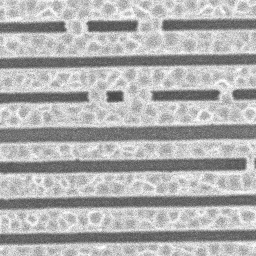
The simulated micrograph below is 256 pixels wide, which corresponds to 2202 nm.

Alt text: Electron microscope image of parallel lines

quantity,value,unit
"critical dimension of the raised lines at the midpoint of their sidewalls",206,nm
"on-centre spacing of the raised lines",303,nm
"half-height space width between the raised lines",95.6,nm